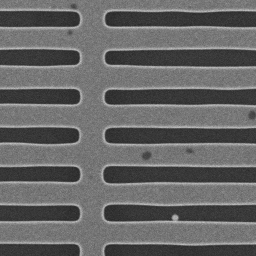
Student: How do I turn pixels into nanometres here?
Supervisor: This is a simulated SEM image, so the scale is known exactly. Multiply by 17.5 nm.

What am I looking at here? groups of lines, slits or small figures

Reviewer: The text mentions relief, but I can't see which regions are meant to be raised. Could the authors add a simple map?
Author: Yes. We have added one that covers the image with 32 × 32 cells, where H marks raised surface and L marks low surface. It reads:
HHHHHHHHHHHHHHHHHHHHHHHHHHHHHHHH
LLLLLLLLLHHHHHLLLLLLLLLLLLLLLLLL
LLLLLLLLLLHHHLLLLLLLLLLLLLLLLLLL
HHHHHHHHHHHHHHHHHHHHHHHHHHHHHHHH
HHHHHHHHHHHHHHHHHHHHHHHHHHHHHHHH
HHHHHHHHHHHHHHHHHHHHHHHHHHHHHHHH
LLLLLLLLLLHHHHLLLLLLLLLLLLLLLLLL
LLLLLLLLLLHHHLLLLLLLLLLLLLLLLLLL
HHHHHHHHHHHHHHHHHHHHHHHHHHHHHHHH
HHHHHHHHHHHHHHHHHHHHHHHHHHHHHHHH
HHHHHHHHHHHHHHHHHHHHHHHHHHHHHHHH
LLLLLLLLLLHHHLLLLLLLLLLLLLLLLLLL
LLLLLLLLLLHHHLLLLLLLLLLLLLLLLLLL
HHHHHHHHHHHHHHHHHHHHHHHHHHHHHHHH
HHHHHHHHHHHHHHHHHHHHHHHHHHHHHHHH
HHHHHHHHHHHHHHHHHHHHHHHHHHHHHHHH
LLLLLLLLLLHHHLLLLLLLLLLLLLLLLLLL
LLLLLLLLLLHHHLLLLLLLLLLLLLLLLLLL
HHHHHHHHHHHHHHHHHHHHHHHHHHHHHHHH
HHHHHHHHHHHHHHHHHHHHHHHHHHHHHHHH
HHHHHHHHHHHHHHHHHHHHHHHHHHHHHHHH
LLLLLLLLLLHHHLLLLLLLLLLLLLLLLLLL
LLLLLLLLLLHHHLLLLLLLLLLLLLLLLLLL
HHHHHHHHHHHHHHHHHHHHHHHHHHHHHHHH
HHHHHHHHHHHHHHHHHHHHHHHHHHHHHHHH
HHHHHHHHHHHHHHHHHHHHHHHHHHHHHHHH
LLLLLLLLLLHHHLLLLLLLLLLLLLLLLLLL
LLLLLLLLLLHHHLLLLLLLLLLLLLLLLLLL
HHHHHHHHHHHHHHHHHHHHHHHHHHHHHHHH
HHHHHHHHHHHHHHHHHHHHHHHHHHHHHHHH
LLLLLLLLLHHHHHLLHHLLHHHHHHHHHHHH
LLLLLLLLLLHHHLLLLLLLLLLLLLLLLLLL